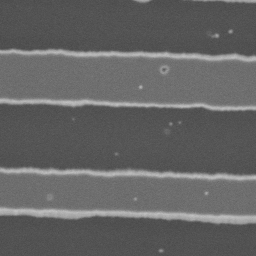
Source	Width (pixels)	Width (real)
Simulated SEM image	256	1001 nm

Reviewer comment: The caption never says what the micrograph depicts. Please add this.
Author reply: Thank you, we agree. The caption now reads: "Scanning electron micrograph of lines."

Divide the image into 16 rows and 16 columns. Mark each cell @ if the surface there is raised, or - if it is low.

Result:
----------------
----------------
----------------
@@@@@@@@@@@-----
@@@@@@@@@@@@@@@@
@@@@@@@@@@@@@@@@
-------@@@@@@@@@
----------------
----------------
----------------
----------------
@@@@@@@@@@@@@@@@
@@@@@@@@@@@@@@@@
-----------@@@@@
----------------
----------------